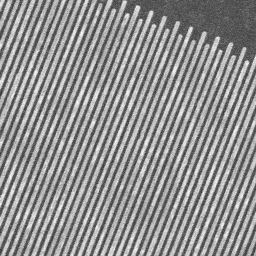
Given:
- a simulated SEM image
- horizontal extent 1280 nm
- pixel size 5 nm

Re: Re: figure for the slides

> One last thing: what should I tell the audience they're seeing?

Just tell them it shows parallel lines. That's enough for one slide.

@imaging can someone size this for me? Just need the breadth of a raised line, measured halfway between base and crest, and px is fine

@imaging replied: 3.48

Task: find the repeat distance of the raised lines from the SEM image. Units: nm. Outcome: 35.8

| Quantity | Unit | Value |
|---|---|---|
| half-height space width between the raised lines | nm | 16.9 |